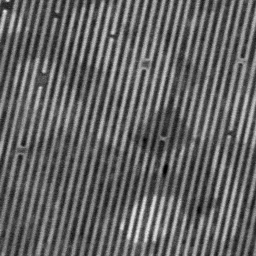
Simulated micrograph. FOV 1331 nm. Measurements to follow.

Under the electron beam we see parallel lines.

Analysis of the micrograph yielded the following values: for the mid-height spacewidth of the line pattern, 29.2 nm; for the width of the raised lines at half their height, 2.44 pixels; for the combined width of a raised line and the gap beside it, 0.044 um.